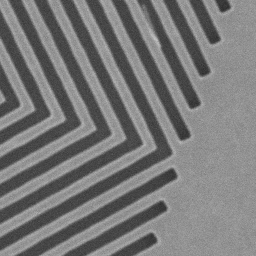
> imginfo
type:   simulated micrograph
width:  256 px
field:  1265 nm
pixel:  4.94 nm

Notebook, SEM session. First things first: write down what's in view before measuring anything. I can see groups of lines, slits or small figures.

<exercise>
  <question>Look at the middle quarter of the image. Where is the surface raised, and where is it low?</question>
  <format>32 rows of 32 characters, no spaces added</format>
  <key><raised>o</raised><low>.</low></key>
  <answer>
....ooo...ooo....ooo...ooo....oo
o....oo....ooo...ooo....ooo...oo
o....ooo...ooo....ooo...ooo....o
oo...ooo....ooo...ooo....ooo...o
oo....ooo...ooo....ooo...ooo....
ooo....oo....ooo...ooo....ooo...
ooo....ooo...ooo....ooo...ooo...
.ooo...ooo....ooo...ooo....ooo..
..oo....ooo...ooo....ooo...ooo..
..ooo...ooo....ooo...ooo....ooo.
..ooo....ooo...ooo....ooo...ooo.
...ooo...ooo....ooo...ooo....ooo
...ooo....ooo...ooo....ooo...ooo
....ooo...ooo....ooo...ooo....oo
....ooo....ooo...ooo....oo....oo
....oooo...ooo....ooo...ooo....o
...ooooo....oo....ooo....ooo...o
.ooooo......ooo....ooo...ooo....
oooo.......oooo....ooo....ooo..o
oo.......ooooo......oo....oooooo
.......ooooo.......oooo....ooooo
......ooooo.......ooooo....ooooo
....ooooo.......ooooo......ooooo
..ooooo.......ooooo.......oooooo
ooooo.......oooooo......oooooooo
oooo......oooooo......oooooooooo
oo.......ooooo.......ooooo..oooo
.......ooooo.......ooooo....oooo
.....ooooo.......ooooo......oooo
...ooooo.......ooooo.......ooooo
..ooooo.......ooooo......ooooooo
ooooo.......ooooo.......oooooooo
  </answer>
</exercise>